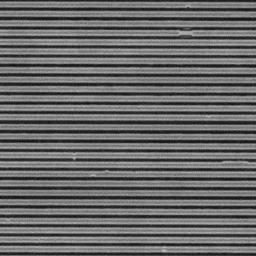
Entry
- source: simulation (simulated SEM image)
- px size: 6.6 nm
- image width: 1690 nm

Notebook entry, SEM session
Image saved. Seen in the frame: parallel lines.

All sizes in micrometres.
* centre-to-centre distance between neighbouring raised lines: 0.0621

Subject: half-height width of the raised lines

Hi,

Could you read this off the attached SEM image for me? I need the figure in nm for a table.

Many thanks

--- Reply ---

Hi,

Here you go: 36.3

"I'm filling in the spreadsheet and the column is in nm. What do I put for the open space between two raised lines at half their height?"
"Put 30.5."